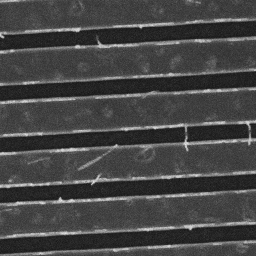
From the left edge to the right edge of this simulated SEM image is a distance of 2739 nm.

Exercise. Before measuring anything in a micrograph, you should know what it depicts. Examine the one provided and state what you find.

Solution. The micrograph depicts parallel lines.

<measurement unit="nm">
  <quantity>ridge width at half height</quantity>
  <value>375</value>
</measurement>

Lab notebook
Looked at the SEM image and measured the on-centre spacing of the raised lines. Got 544 nm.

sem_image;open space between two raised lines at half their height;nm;172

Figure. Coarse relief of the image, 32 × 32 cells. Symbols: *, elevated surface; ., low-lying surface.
********************************
********************************
*******************************.
*************...................
................................
.................***************
********************************
********************************
********************************
********************.*..........
**.*............................
.......................*********
....****************************
********************************
********************************
***************************...*.
*********.......................
.............................***
............********************
********************************
********************************
********************************
***************.................
................................
...................*.***********
********************************
********************************
********************************
**********************.*........
****............................
..........................******
......**************************